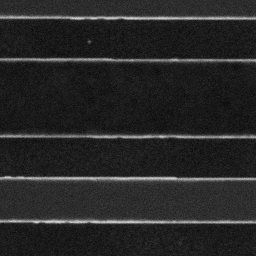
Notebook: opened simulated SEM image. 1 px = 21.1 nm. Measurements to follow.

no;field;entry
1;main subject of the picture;lines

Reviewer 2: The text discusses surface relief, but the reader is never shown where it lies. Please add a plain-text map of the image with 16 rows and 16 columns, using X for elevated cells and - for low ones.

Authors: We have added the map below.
XXXXXXXXXXXXXXXX
----------------
----------------
----------------
XXXXXXXXXXXXXXXX
XXXXXXXXXXXXXXXX
XXXXXXXXXXXXXXXX
XXXXXXXXXXXXXXXX
XXXXXXXXXXXXXXXX
----------------
----------------
XXXXXXXXXXXXXXXX
XXXXXXXXXXXXXXXX
XXXXXXXXXXXXXXXX
----------------
----------------